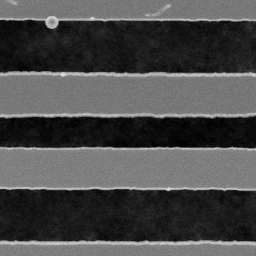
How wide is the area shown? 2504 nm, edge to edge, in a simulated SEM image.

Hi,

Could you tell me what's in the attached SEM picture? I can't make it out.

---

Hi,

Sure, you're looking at lines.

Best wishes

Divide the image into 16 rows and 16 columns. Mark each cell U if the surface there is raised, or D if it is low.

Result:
UUUUUUUUUUUUUUUU
DDDUDDDDDDDDDDDD
DDDDDDDDDDDDDDDD
DDDDDDDDDDDDDDDD
DDUDDDDDDDDDDDDD
UUUUUUUUUUUUUUUU
UUUUUUUUUUUUUUUU
DDDDDDDDDDDDDDDD
DDDDDDDDDDDDDDDD
UUUUUUUUUUUUUUUU
UUUUUUUUUUUUUUUU
UUUUUUUUUUUUUUUU
DDDDDDDDDDDDDDDD
DDDDDDDDDDDDDDDD
DDDDDDDDDDDDDDDD
UUUUUUUUUUUUUUUU